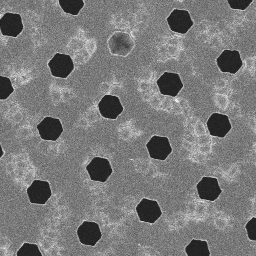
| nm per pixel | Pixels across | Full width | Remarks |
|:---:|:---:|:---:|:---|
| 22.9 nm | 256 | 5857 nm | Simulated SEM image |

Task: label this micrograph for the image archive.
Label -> a regular array of holes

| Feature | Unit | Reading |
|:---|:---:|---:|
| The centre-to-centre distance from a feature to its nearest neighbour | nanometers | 1460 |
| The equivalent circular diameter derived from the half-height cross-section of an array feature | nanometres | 553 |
